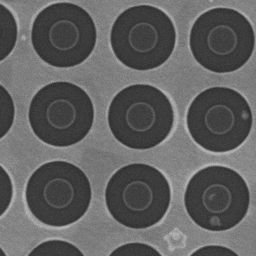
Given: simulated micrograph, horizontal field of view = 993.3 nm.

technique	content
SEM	an array of small figures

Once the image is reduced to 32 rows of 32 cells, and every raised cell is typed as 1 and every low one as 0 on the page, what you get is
11111100011111111111111111111111
00111000000111100000011111000011
00110000000011000000001100000001
00110000000011000000001100000000
00110000000011000000001100000000
00110000000011000000001100000000
01111000000111000000001100000000
11111000000111100000011110000001
11111111111111110001111111000011
11111111111111111111111111111111
11111100011111111011111111111111
01111000000111100000111110000011
00110000000111000000011100000001
00110000000011000000001100000001
00110000000010000000001000000001
00110000000011000000001000000001
01110000000111000000011100000001
11111000001111100000011100000001
11111111111111110001111110000011
11111111111111111111111111111111
11111000011111111011111111111111
01110000001111100000111100000011
01110000000111000000011100000011
00100000000110000000011000000001
00100000000110000000011000000001
01100000000110000000011000000001
01110000000111000000011000000001
11110000001111100000111100000011
11111111111111110011111110000111
11111111111111111111111111111111
11111000011111110011111111111111
11110000001111000000111100000111